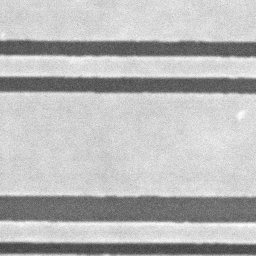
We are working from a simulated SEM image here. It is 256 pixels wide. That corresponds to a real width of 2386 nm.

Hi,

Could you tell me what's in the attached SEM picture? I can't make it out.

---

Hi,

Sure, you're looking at lines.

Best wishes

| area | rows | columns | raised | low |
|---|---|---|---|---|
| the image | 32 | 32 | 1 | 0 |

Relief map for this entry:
11111111111111111111111111111111
11111111111111111111111111111111
11111111111111111111111111111111
11111111111111111111111111111111
11111111111111111111111111111111
00000000000000000000000000000000
00000000000000000000000000000000
11111111111111111111111111111111
11111111111111111111111111111111
00000000110111111111111111111111
00000000000000000000000000000000
00000000000000000000000000000000
11111111111111111111111111111111
11111111111111111111111111111111
11111111111111111111111111111111
11111111111111111111111111111111
11111111111111111111111111111111
11111111111111111111111111111111
11111111111111111111111111111111
11111111111111111111111111111111
11111111111111111111111111111111
11111111111111111111111111111111
11111111111111111111111111111111
11111111111111111111111111111111
00000000000000000000000000000000
00000000000000000000000000000000
00000000000000000000000000000000
00000000000000000000000000000000
11111111111111111111111111111111
11111111111111111111111111111111
00000000000000000000000000000000
00000000000000000000000000000000